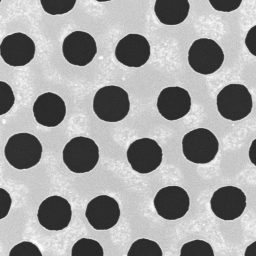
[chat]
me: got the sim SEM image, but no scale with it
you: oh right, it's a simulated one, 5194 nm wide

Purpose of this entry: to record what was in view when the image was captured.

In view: a regular array of holes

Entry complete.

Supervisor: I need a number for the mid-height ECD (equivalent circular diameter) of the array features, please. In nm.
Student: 715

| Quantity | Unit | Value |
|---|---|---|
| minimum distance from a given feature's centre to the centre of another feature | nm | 1090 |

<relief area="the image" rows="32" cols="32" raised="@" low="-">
@@@@@----@@@@@@@@@@-----@@----@@
@@@@@@--@@@@@@@@@@@-----@@@@-@@@
@@@@@@@@@@@@@@@@@@@@---@@@@@@@@@
@@@@@@@@@@@@@@@@@@@@@@@@@@@@@@@-
@--@@@@@---@@@@@--@@@@@@@@@@@@@-
----@@@@----@@@----@@@@@---@@@@-
----@@@@----@@-----@@@@@----@@@-
----@@@@----@@@---@@@@@@----@@@@
@@@@@@@@@@@@@@@@@@@@@@@@---@@@@@
@@@@@@@@@@@@@@@@@@@@@@@@@@@@@@@@
-@@@@@@@@@@@@@@@@@@@@@@@@@@@@@@@
--@@@@@@@@@@----@@@@---@@@@----@
--@@@---@@@@----@@@@----@@@-----
-@@@----@@@@----@@@@----@@@----@
@@@@----@@@@----@@@@---@@@@@---@
@@@@@--@@@@@@@@@@@@@@@@@@@@@@@@@
@@@@@@@@@@@@@@@@@@@@@@@@--@@@@@@
@----@@@@---@@@@@--@@@@----@@@@@
@----@@@----@@@@----@@@----@@@@-
@----@@@----@@@@----@@@----@@@@-
@---@@@@----@@@@----@@@@@@@@@@@@
@@@@@@@@@--@@@@@@--@@@@@@@@@@@@@
@@@@@@@@@@@@@@@@@@@@@@@@@@@@@@@@
@@@@@@@@@@@@@@@@@@@@---@@@@---@@
-@@@@@-@@@@@-@@@@@@-----@@@----@
-@@@@----@@----@@@@-----@@-----@
-@@@@----@@----@@@@@---@@@@---@@
@@@@@----@@----@@@@@@-@@@@@@-@@@
@@@@@@--@@@@--@@@@@@@@@@@@@@@@@@
@@@@@@@@@@@@@@@@@@@@@@@@@@@@@@@@
@@--@@@@@---@@@@@---@@@---@@@@@-
@----@@@@----@@@----@@@----@@@@-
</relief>